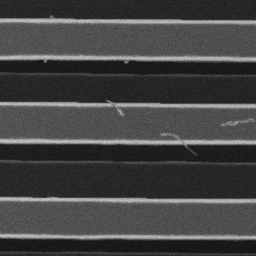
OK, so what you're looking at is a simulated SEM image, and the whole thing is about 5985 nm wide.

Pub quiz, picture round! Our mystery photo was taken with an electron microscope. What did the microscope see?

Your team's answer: lines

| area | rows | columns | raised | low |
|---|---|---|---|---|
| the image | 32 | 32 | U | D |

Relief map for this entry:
DDDDDDDDDDDDDDDDDDDDDDDDDDDDDDDD
DDDDDDDDDDDDDDDDDDDDDDDDDDDDDDDD
UUUUUUUUUUUUUUUUUUUUUDDDDDDDDDDD
UUUUUUUUUUUUUUUUUUUUUUUUUUUUUUUU
UUUUUUUUUUUUUUUUUUUUUUUUUUUUUUUU
UUUUUUUUUUUUUUUUUUUUUUUUUUUUUUUU
UUUUUUUUUUUUUUUUUUUUUUUUUUUUUUUU
DDDDDDDDDDDDDDDDDUUUUUUUUUUUUUUU
DDDDDDDDDDDDDDDDDDDDDDDDDDDDDDDD
DDDDDDDDDDDDDDDDDDDDDDDDDDDDDDDD
DDDDDDDDDDDDDDDDDDDDDDDDDDDDDDDD
DDDDDDDDDDDDDDDDDDDDDDDDDDDDDDDD
DDDDDDDDDDDDDDDDDDDDDDDDDDDDDDDD
UUUUUUUUUUUUUUUUUUUUUUUUUUUUUUUU
UUUUUUUUUUUUUUUUUUUUUUUUUUUUUUUU
UUUUUUUUUUUUUUUUUUUUUUUUUUUUUUUU
UUUUUUUUUUUUUUUUUUUUUUUUUUUUUUUU
UUUUUUUUUUUUUUUUUUUUUUUUUUUUUUUU
DDDDDDDDDDDDDDDDDDDDDDDDDDDDDDDD
DDDDDDDDDDDDDDDDDDDDDDDDDDDDDDDD
DDDDDDDDDDDDDDDDDDDDDDDDDDDDDDDD
DDDDDDDDDDDDDDDDDDDDDDDDDDDDDDDD
DDDDDDDDDDDDDDDDDDDDDDDDDDDDDDDD
DDDDDDDDDDDDDDDDDDDDDDDDDDDDDDDD
DDDDDDDDDDDDDDDDDDDDDDDDDDDDDDDD
UUUUUUUUUUUUUUUUUUUUUUUUUUUUUUUU
UUUUUUUUUUUUUUUUUUUUUUUUUUUUUUUU
UUUUUUUUUUUUUUUUUUUUUUUUUUUUUUUU
UUUUUUUUUUUUUUUUUUUUUUUUUUUUUUUU
UUUUUUUUUUUUUUUUUUUUUUUUUUUUUUUU
DDDDDDDDDDDDDDDDDDDDDDDDDDDDDDDD
DDDDDDDDDDDDDDDDDDDDDDDDDDDDDDDD